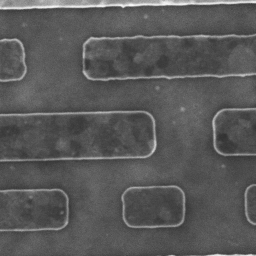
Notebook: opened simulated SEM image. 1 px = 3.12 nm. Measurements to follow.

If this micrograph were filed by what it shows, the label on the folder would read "one or a few lines or trenches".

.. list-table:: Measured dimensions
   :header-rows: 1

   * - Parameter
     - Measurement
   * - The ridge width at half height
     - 0.128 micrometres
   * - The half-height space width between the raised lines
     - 99.8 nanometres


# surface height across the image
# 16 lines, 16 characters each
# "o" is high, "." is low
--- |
oo..............
................
o.....oooooooooo
oo...ooooooooooo
oo...ooooooooooo
................
................
oooooooooo...ooo
oooooooooo...ooo
ooooooooo.....oo
................
................
oooo....oooo...o
oooo....ooo....o
................
................